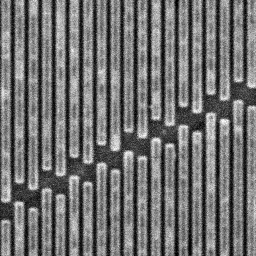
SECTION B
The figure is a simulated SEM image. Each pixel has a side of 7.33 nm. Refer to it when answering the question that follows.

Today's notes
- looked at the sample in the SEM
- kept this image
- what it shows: parallel lines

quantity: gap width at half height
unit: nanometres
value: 49.5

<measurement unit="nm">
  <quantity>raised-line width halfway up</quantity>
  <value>55.9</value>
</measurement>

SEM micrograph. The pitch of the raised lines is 0.1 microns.